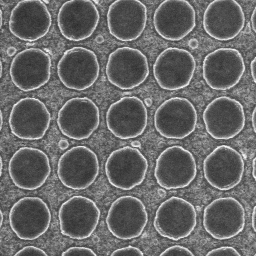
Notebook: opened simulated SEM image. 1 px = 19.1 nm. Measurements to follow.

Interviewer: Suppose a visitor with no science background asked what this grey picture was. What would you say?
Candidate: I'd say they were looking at a regular array of raised bodies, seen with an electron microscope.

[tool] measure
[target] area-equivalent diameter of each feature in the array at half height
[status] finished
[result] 779 nanometres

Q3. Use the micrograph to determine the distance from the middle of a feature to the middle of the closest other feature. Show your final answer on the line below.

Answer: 925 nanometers